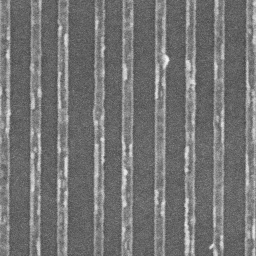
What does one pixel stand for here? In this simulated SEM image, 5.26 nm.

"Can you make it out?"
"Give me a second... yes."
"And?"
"parallel lines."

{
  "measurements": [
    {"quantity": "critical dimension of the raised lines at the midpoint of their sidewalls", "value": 51.3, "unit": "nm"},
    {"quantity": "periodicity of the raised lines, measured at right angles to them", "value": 161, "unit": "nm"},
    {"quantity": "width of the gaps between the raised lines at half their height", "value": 0.112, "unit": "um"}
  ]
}